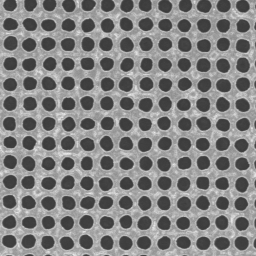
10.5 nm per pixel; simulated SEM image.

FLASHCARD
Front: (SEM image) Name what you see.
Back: a regular array of holes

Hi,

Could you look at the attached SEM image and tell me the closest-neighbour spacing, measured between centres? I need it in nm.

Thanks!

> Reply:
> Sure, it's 198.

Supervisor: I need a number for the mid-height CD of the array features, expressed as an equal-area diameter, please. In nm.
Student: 146